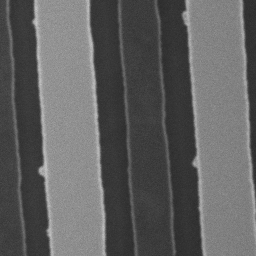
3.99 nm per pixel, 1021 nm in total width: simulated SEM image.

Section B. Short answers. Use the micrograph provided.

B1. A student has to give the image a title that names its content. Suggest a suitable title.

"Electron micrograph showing lines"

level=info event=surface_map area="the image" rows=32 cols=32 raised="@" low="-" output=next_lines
@---@@@@@@@----@@@@@---@@@@@@@--
@---@@@@@@@----@@@@@---@@@@@@@--
@---@@@@@@@----@@@@@---@@@@@@@--
@---@@@@@@@----@@@@@----@@@@@@--
@----@@@@@@----@@@@@----@@@@@@--
@----@@@@@@----@@@@@----@@@@@@--
@----@@@@@@@---@@@@@----@@@@@@@-
@@---@@@@@@@---@@@@@----@@@@@@@-
@@---@@@@@@@---@@@@@----@@@@@@@-
@@---@@@@@@@----@@@@----@@@@@@@-
@@---@@@@@@@----@@@@----@@@@@@@-
@@---@@@@@@@----@@@@@---@@@@@@@-
@@---@@@@@@@----@@@@@---@@@@@@@-
@@---@@@@@@@----@@@@@---@@@@@@@-
@@---@@@@@@@----@@@@@---@@@@@@@-
@@---@@@@@@@----@@@@@---@@@@@@@-
@@---@@@@@@@----@@@@@---@@@@@@@-
@@---@@@@@@@----@@@@@----@@@@@@-
@@---@@@@@@@----@@@@@----@@@@@@-
@@----@@@@@@----@@@@@----@@@@@@-
@@----@@@@@@@---@@@@@----@@@@@@-
@@---@@@@@@@@---@@@@@----@@@@@@-
@@----@@@@@@@---@@@@@----@@@@@@@
@@----@@@@@@@---@@@@@----@@@@@@@
@@@---@@@@@@@---@@@@@----@@@@@@@
@@@---@@@@@@@---@@@@@----@@@@@@@
@@@---@@@@@@@---@@@@@@---@@@@@@@
@@@---@@@@@@@----@@@@----@@@@@@@
@@@---@@@@@@@----@@@@@---@@@@@@@
@@@---@@@@@@@----@@@@@---@@@@@@@
@@@---@@@@@@@----@@@@@---@@@@@@@
@@@---@@@@@@@----@@@@@---@@@@@@@